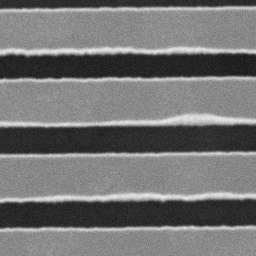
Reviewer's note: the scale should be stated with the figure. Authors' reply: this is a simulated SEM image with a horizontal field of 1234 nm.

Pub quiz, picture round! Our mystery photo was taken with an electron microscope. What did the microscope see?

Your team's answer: lines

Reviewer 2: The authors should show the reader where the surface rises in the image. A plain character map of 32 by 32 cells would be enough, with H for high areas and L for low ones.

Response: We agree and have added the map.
LLLLLLLLLLLLLLLLLLLLLLLLLLLLLLLL
HHHHHHHHHHHHHHHHHHHHHHHHHHHHHHHH
HHHHHHHHHHHHHHHHHHHHHHHHHHHHHHHH
HHHHHHHHHHHHHHHHHHHHHHHHHHHHHHHH
HHHHHHHHHHHHHHHHHHHHHHHHHHHHHHHH
HHHHHHHHHHHHHHHHHHHHHHHHHHHHHHHH
HHHHHHHHHHHHHHHHHHHHHHLHLHHHHHHH
LLLLLLLLLLLLLLLLLLLLLLLLLLLLLLLL
LLLLLLLLLLLLLLLLLLLLLLLLLLLLLLLL
LLLLLLLLLLLLLLLLLLLLLLLLLLLLLLLL
HHHHHHHHHHHHHHHHHHHHHHHHHHHHHHHH
HHHHHHHHHHHHHHHHHHHHHHHHHHHHHHHH
HHHHHHHHHHHHHHHHHHHHHHHHHHHHHHHH
HHHHHHHHHHHHHHHHHHHHHHHHHHHHHHHH
HHHHHHHHHHHHHHHHHHHHHHHHHHHHHHHH
HHHHHHHHHHHHHHHHHHHHHLLLLLLLLLLL
LLLLLLLLLLLLLLLLLLLLLLLLLLLLLLLL
LLLLLLLLLLLLLLLLLLLLLLLLLLLLLLLL
LLLLLLLLLLLLLLLLLLLLLLLLLLLLLLLL
HHHHHHHHHHHHHHHHHHHHHHHHHHHHHHHH
HHHHHHHHHHHHHHHHHHHHHHHHHHHHHHHH
HHHHHHHHHHHHHHHHHHHHHHHHHHHHHHHH
HHHHHHHHHHHHHHHHHHHHHHHHHHHHHHHH
HHHHHHHHHHHHHHHHHHHHHHHHHHHHHHHH
HHHHHHHHHHHHHHHHHHHHHHHHHHHHHHHH
LLLLLLLLLLLLLLLLLLLLLLLLLLLLLLLL
LLLLLLLLLLLLLLLLLLLLLLLLLLLLLLLL
LLLLLLLLLLLLLLLLLLLLLLLLLLLLLLLL
LLLLLHHHHLLLLLLHHHHHHHHHHHHHHHHH
HHHHHHHHHHHHHHHHHHHHHHHHHHHHHHHH
HHHHHHHHHHHHHHHHHHHHHHHHHHHHHHHH
HHHHHHHHHHHHHHHHHHHHHHHHHHHHHHHH